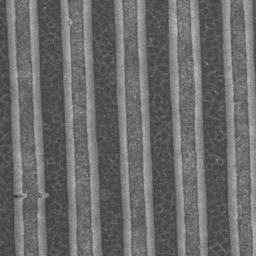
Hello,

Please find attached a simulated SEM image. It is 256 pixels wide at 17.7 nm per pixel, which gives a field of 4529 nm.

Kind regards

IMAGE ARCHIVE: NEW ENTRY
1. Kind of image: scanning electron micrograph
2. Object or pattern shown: parallel lines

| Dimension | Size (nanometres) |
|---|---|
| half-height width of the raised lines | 431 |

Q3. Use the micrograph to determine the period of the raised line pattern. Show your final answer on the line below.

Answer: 949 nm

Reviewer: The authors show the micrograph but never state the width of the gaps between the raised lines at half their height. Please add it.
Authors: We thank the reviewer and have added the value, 521 nm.